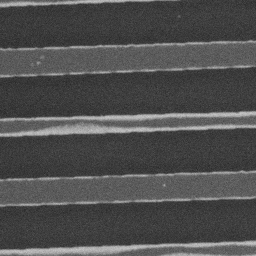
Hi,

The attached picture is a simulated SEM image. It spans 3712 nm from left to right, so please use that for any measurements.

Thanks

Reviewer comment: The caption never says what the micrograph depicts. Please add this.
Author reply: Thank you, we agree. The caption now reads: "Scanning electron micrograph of lines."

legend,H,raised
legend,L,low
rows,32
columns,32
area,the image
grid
HHHHHHLLLLLLLLLLLLLLLLLLLLLLLLLL
LLLLLLLLLLLLLLLLLLLLLLLLLLLLLLLL
LLLLLLLLLLLLLLLLLLLLLLLLLLLLLLLL
LLLLLLLLLLLLLLLLLLLLLLLLLLLLLLLL
LLLLLLLLLLLLLLLLLLLLLLLLLLLLLLLL
LLLLLLLLLLLLLLLLLLLHHHHHHHHHHHHH
HHHHHHHHHHHHHHHHHHHHHHHHHHHHHHHH
HHHHHHHHHHHHHHHHHHHHHHHHHHHHHHHH
HHHHHHHHHHHHHHHHHHHHHHHHHLLLLLLL
HHLLLLLLLLLLLLLLLLLLLLLLLLLLLLLL
LLLLLLLLLLLLLLLLLLLLLLLLLLLLLLLL
LLLLLLLLLLLLLLLLLLLLLLLLLLLLLLLL
LLLLLLLLLLLLLLLLLLLLLLLLLLLLLLLL
LLLLLLLLLLLLLLLLLLLLLLLLLLLLLLLL
LLLLLLLLLLLLLLLLLLHHHHHHHHHHHHHH
HHHHHHHHHHHHHHHHHHHHHHHHHHHHHHHH
HHHHHHHHLLLLLLLLLLLLLLLLLLLLLLLL
LLLLLLLLLLLLLLLLLLLLLLLLLLLLLLLL
LLLLLLLLLLLLLLLLLLLLLLLLLLLLLLLL
LLLLLLLLLLLLLLLLLLLLLLLLLLLLLLLL
LLLLLLLLLLLLLLLLLLLLLLLLLLLLLLLL
LLLLLLLLLLLLLLLLLLLLLLLLLLLLLLHH
LHHHHHHHHHHHHHHHHHHHHHHHHHHHHHHH
HHHHHHHHHHHHHHHHHHHHHHHHHHHHHHHH
HHHHHHHHHHHHHHHHHHHHHHHHHHHHHHHH
HHHHHHHHLLLLLLLLLLLLLLLLLLLLLLLL
LLLLLLLLLLLLLLLLLLLLLLLLLLLLLLLL
LLLLLLLLLLLLLLLLLLLLLLLLLLLLLLLL
LLLLLLLLLLLLLLLLLLLLLLLLLLLLLLLL
LLLLLLLLLLLLLLLLLLLLLLLLLLLLLLLL
LLLLLLLLLLLLLLLLLLLLLLLLLLHHHHHH
HHHHHHHHHHHHHHHHHHHHHHHHHHHHHHHH